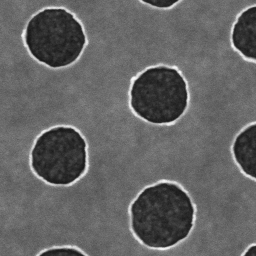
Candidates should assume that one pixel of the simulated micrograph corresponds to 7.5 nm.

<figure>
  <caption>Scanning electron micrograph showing holes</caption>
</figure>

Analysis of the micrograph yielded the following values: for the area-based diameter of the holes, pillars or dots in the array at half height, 429 nanometers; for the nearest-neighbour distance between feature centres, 882 nm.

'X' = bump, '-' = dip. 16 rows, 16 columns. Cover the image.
XXXXXXXXXXXXXXXX
XX---XXXXXXXXXX-
XX---XXXXXXXXXX-
XX---XXXXXXXXXX-
XXXXXXXXX--XXXXX
XXXXXXXX----XXXX
XXXXXXXX----XXXX
XXXXXXXXX--XXXXX
XXX--XXXXXXXXXX-
XX---XXXXXXXXXX-
XX---XXXXXXXXXX-
XXXXXXXXXX-XXXXX
XXXXXXXX----XXXX
XXXXXXXX----XXXX
XXXXXXXX----XXXX
XXXXXXXXXXXXXXXX